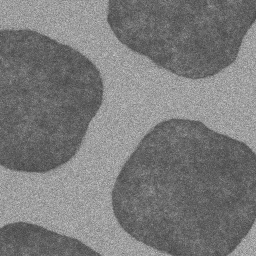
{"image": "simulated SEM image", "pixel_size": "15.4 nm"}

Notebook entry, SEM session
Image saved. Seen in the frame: holes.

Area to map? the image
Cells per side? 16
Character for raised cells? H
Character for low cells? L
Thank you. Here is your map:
HHHHHHHLLLLLLLLL
HHHHHHHLLLLLLLLL
LLLHHHHLLLLLLLLH
LLLLLHHHHLLLLLLH
LLLLLLHHHHHLLLHH
LLLLLLHHHHHHHHHH
LLLLLLHHHHHHHHHH
LLLLLLHHHHLLHHHH
LLLLLHHHHLLLLLHH
LLLLLHHHLLLLLLLL
LLLLHHHHLLLLLLLL
HHHHHHHLLLLLLLLL
HHHHHHHLLLLLLLLL
HHHHHHHLLLLLLLLL
LLLHHHHHLLLLLLLL
LLLLLLHHHHLLLLLH